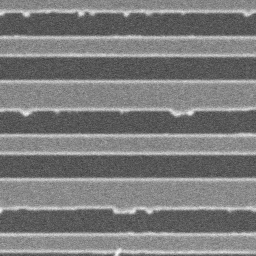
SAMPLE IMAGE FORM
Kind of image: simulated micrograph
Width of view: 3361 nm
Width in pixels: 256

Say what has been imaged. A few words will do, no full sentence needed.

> lines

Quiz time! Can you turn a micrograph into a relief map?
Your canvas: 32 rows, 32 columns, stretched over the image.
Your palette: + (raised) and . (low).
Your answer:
++++++++++++++++++++++++++++++++
+.++.....+++...++.+.+.+.......++
................................
................................
.++...........+.+.......+.......
++++++++++++++++++++++++++++++++
++++++++++++++++++++++++++++++++
................................
................................
................................
++++++++++++++++++++++++++++++++
++++++++++++++++++++++++++++++++
++++++++++++++++++++++++++++++++
++++++++++++++++++++++++++++++++
................................
................................
................................
++++++++++++++++++++++++++++++++
++++++++++++++++++++++++++++++++
................................
................................
................................
++++++++++++++++++++++++++++++++
++++++++++++++++++++++++++++++++
++++++++++++++++++++++++++++++++
++++++++++++++++++++++++++++++++
...............++...............
................................
................................
++++++++++++++++++++++++++++++++
++++++++++++++++++++++++++++++++
............+++.++++++++++++++++